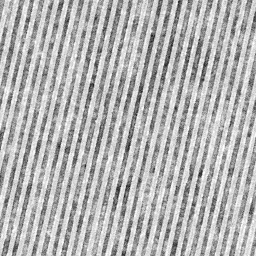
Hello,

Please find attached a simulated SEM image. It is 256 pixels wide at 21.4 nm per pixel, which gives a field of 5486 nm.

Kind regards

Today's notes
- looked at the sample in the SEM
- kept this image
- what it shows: parallel lines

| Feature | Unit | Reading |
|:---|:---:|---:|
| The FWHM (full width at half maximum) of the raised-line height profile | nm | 99.4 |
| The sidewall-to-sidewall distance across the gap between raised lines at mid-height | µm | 0.118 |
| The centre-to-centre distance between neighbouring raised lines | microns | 0.207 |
